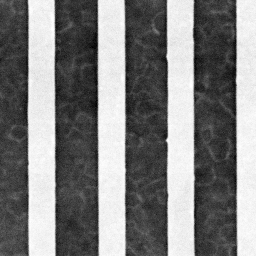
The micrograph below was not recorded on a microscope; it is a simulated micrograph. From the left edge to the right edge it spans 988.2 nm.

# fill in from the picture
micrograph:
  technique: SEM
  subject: one or a few lines or trenches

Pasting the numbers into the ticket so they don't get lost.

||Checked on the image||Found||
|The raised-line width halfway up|97.4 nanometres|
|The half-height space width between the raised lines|168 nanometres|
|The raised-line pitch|268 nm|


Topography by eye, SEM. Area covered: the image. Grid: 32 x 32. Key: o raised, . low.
....ooo.....ooo......ooo......oo
....ooo.....ooo......ooo......oo
....ooo.....ooo......ooo......oo
....ooo.....ooo......ooo......oo
....ooo.....ooo......ooo......oo
....ooo.....ooo......ooo......oo
....ooo.....ooo......ooo......oo
....ooo.....ooo......ooo......oo
....ooo.....ooo......ooo......oo
....ooo.....oooo.....ooo......oo
....ooo.....oooo.....ooo......oo
....ooo.....oooo.....ooo......oo
....ooo.....oooo.....ooo......oo
....ooo.....oooo.....ooo......oo
....ooo.....oooo.....ooo......oo
....ooo.....oooo.....ooo......oo
....ooo.....oooo.....ooo......oo
....ooo.....oooo.....ooo......oo
....ooo.....oooo.....ooo......oo
....ooo.....oooo.....ooo......oo
....ooo.....oooo.....ooo......oo
....ooo.....oooo.....ooo......oo
....ooo.....oooo.....ooo......oo
....ooo.....oooo.....ooo......oo
....ooo.....oooo.....ooo......oo
....ooo.....oooo.....ooo......oo
....ooo.....oooo.....ooo......oo
....ooo.....oooo.....ooo......oo
....ooo.....oooo.....ooo......oo
....ooo.....oooo.....ooo......oo
....ooo.....oooo.....ooo......oo
....ooo.....oooo.....ooo......oo